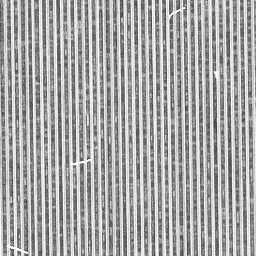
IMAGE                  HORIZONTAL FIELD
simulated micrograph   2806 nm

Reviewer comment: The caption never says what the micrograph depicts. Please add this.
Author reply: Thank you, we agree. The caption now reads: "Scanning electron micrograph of parallel lines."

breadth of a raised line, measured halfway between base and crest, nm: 28.8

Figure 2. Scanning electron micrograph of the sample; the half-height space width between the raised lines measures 0.0521 microns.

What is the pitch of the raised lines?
77.5 nm